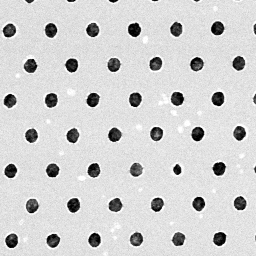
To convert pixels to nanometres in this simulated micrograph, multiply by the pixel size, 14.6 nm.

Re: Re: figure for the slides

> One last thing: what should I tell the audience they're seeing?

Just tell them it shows a regular array of holes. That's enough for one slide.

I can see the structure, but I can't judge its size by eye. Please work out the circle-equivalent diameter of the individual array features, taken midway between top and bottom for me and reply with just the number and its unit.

210 nanometers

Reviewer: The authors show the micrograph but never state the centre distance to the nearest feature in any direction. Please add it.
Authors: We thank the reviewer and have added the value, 591 nm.